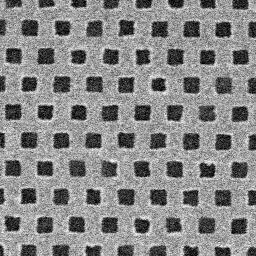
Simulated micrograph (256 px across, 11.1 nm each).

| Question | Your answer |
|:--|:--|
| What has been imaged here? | a regular array of holes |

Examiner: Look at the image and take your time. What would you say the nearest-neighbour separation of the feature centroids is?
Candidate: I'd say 354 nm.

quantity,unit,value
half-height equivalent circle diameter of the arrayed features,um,0.197